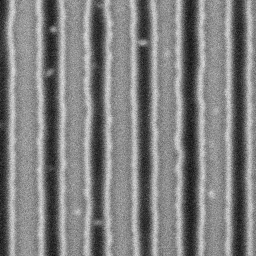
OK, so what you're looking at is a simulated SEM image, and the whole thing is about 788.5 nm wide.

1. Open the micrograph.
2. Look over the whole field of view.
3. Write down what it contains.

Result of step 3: lines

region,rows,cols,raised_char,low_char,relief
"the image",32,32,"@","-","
@@---@@@---@@@--@@@---@@@---@@@-
@@---@@@---@@@--@@@---@@@---@@@-
@@---@@@---@@@---@@---@@@---@@@-
@----@@@---@@@--@@@---@@@---@@@-
@----@@@---@@@--@@@@--@@@---@@@-
@@---@@@---@@@---@@@--@@@---@@@-
@@---@@@---@@@---@@@--@@@---@@@-
@@---@@@---@@@---@@---@@@---@@@-
@@---@@@---@@@---@@---@@@---@@@-
@@---@@@---@@@---@@---@@@---@@@-
@@---@@@---@@@---@@---@@@---@@@-
@@---@@@---@@@--@@@@--@@@---@@@-
@@---@@@---@@@---@@@--@@@---@@@-
@@---@@@---@@@---@@---@@@---@@@-
@@---@@@---@@@---@@---@@@---@@@-
@@---@@@---@@@---@@---@@@---@@@-
@@---@@@---@@@---@@@--@@@---@@@-
@@---@@@---@@@---@@@--@@@---@@@-
@@---@@@---@@@---@@---@@@---@@@-
@@---@@@---@@@---@@@--@@@---@@@-
@@---@@@---@@@---@@@--@@@---@@@-
@@---@@@---@@@---@@@--@@@---@@@-
@@---@@@---@@@---@@---@@@---@@@-
@@---@@@---@@@---@@---@@@---@@@-
@@---@@@---@@@---@@@--@@@---@@@-
@@---@@@---@@@---@@---@@@---@@@-
@@---@@@---@@@---@@@--@@@---@@@-
@@---@@@---@@@---@@@--@@@---@@@-
@@---@@@---@@@---@@@--@@@---@@@-
@@---@@@---@@@---@@@--@@@---@@@-
@@---@@@---@@@---@@@--@@@---@@@-
@@---@@@---@@@---@@@--@@@---@@@-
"